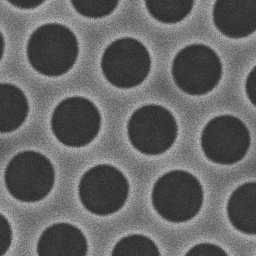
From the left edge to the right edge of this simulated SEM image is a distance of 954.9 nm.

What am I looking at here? a regular array of holes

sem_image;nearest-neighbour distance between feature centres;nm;268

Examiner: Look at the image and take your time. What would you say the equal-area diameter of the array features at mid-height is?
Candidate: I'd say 0.19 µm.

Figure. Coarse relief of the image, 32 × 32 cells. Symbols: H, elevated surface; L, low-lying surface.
HLLLLHHHHLLLLLLHHHLLLLLLHHHLLLLL
HHHHHHHHHHLLLLHHHHHLLLLLHHHLLLLL
HHHHHHHHHHHHHHHHHHHHLLLHHHHLLLLL
HHHHHLLLLHHHHHHHHHHHHHHHHHHLLLLL
HHHHLLLLLHHHHHHHHHHHHHHHHHHHLLLH
LHHLLLLLLLHHHHLLLLHHHHHHLHHHHHHH
HHHLLLLLLLHHHLLLLLLHHHLLLLLHHHHH
HHHHLLLLLLHHHLLLLLLHHHLLLLLLHHHH
HHHHLLLLLHHHHLLLLLLHHLLLLLLLHHHH
HHHHHHLHHHHHHLLLLLHHHHLLLLLLHHHL
LHHHHHHHHHHHHHLLLHHHHHLLLLLHHHHL
LLLHHHHHHHHHHHHHHHHHHHHLLLHHHHHL
LLLHHHHHLLLHHHHHHHHHHHHHHHHHHHHL
LLLLHHHLLLLLHHHHHLLLLHHHHHHHHHHH
LLLHHHLLLLLLLHHHLLLLLLHHHHHLLHHH
LLLHHHLLLLLLLHHHLLLLLLHHHHLLLLLH
LHHHHHHLLLLLHHHHLLLLLLHHHLLLLLLH
HHHHHHHLLLLLHHHHLLLLLLHHHLLLLLLH
HHHHHHHHHHHHHHHHHLLLLHHHHLLLLLLH
HHLLLLHHHHHHHHHHHHHHHHHHHHLLLLLH
HLLLLLHHHHHHHHHHHHHHHHHHHHHLLHHH
HLLLLLLHHHHLLLLHHHHHHLLHHHHHHHHH
HLLLLLLHHHLLLLLLHHHHLLLLLHHHHHHH
HLLLLLHHHHLLLLLLHHHLLLLLLHHHHHLL
HHLLLLHHHHLLLLLLHHHLLLLLLHHHHLLL
HHHHHHHHHHLLLLLLHHHLLLLLLHHHLLLL
HHHHHHHHHHHLLLHHHHHHLLLLLHHHLLLL
LHHHHHHHHHHHHHHHHHHHHLLLHHHHHLLL
LHHHHHLLLLHHHHHHHHHHHHHHHHHHHLLL
LLHHHLLLLLLHHHHHLLHHHHHHHHHHHHHH
LHHHHLLLLLLHHHHLLLLHHHHHHLLHHHHH
LHHHHLLLLLLHHHLLLLLLHHHLLLLLHHHH